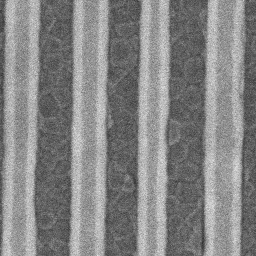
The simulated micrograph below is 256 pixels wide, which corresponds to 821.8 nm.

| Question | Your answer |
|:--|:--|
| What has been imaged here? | one or a few lines or trenches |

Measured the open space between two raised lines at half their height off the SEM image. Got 144 nanometres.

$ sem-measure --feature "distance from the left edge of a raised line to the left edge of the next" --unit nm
217